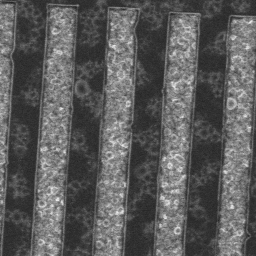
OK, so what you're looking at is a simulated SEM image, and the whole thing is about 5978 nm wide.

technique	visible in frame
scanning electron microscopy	parallel lines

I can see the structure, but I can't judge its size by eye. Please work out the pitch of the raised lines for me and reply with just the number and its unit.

1420 nm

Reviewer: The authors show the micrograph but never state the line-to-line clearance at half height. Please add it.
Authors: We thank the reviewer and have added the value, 702 nanometres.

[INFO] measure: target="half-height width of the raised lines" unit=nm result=702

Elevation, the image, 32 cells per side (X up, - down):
--XXXXXXXXXXXXXXXXXXXXXXXXXXXXXX
--XXXX----XXX----XXXXXXXXXXXXXXX
--XXXX----XXXX---XXXX----XXXX---
--XXXX----XXX----XXXX----XXXX---
--XXXX---XXXX----XXXX----XXX----
--XXXX---XXXX----XXXX----XXX----
-XXXXX---XXXX----XXXX----XXX----
--XXXX---XXXX----XXXX----XXX----
--XXX----XXXX----XXXX----XXX----
--XXX----XXXX----XXXX----XXX----
--XXX----XXXX----XXX----XXXX----
-XXXX----XXXX----XXX----XXXX----
-XXXX----XXXX----XXX----XXXX----
-XXXX----XXXX----XXX----XXXX----
-XXXX----XXXX----XXX----XXXX----
-XXXX----XXXX---XXXX----XXXX----
-XXXX----XXXX---XXXX----XXXX----
-XXXX----XXX----XXXX----XXXX----
-XXXX----XXX----XXXX----XXXX----
-XXXX---XXXX----XXXX----XXXX---X
-XXXX---XXXX----XXXX----XXXX---X
-XXX----XXXX----XXXX----XXXX---X
-XXX----XXXX----XXXX----XXX----X
-XXX----XXXX----XXXX----XXX----X
-XXX----XXXX----XXXX---XXXX----X
-XXX----XXXX----XXXX---XXXX----X
-XXX----XXXX----XXXX---XXXX----X
XXXX----XXXX----XXX----XXXX----X
XXXX----XXXX----XXX----XXXX----X
XXXX----XXXX----XXX----XXXX----X
XXXX----XXXX----XXX----XXXX----X
XXXX----XXXX---XXXX----XXXX----X